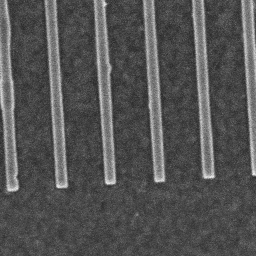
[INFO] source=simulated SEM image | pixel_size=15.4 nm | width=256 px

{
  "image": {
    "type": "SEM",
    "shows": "parallel lines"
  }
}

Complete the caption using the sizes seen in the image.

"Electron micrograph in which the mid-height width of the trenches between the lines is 0.602 µm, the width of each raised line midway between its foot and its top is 158 nm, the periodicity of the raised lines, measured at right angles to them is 756 nm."